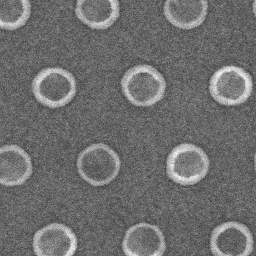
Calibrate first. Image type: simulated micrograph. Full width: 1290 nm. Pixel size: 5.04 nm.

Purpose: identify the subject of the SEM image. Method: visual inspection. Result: raised bodies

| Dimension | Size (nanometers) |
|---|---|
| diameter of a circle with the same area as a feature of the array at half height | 196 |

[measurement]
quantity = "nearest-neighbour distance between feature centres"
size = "446 nanometres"